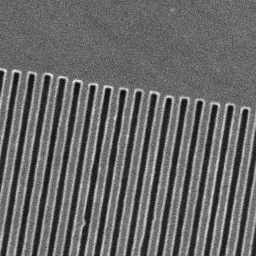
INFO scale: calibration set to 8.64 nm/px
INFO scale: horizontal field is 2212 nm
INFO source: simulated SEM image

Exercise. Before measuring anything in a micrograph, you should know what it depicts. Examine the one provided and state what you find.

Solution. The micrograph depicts parallel lines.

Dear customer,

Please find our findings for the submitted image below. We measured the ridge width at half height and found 74.6 nanometers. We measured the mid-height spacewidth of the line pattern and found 0.0576 um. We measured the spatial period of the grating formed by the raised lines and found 133 nm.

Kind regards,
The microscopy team